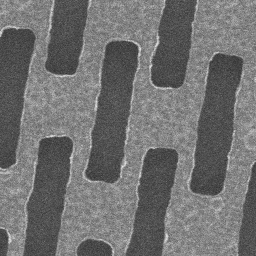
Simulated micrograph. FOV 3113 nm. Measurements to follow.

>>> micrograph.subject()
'holes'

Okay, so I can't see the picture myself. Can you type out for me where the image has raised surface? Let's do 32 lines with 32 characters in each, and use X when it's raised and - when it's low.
XXXXXXX----XXXXXXXXXX----XXXXXXX
XXXXXXX----XXXXXXXXX----XXXXXXXX
XXXXXX-----XXXXXXXXX----XXXXXXXX
XXXXXX-----XXXXXXXXX----XXXXXXXX
----XX----XXXXXXXXXX----XXXXXXXX
----XX----XXX----XXX----XXXXXXXX
----XX----XXX----XX-----XXXXXXXX
----XX----XXX----XX-----XX----XX
----XX----XXX----XX----XXX----XX
----XXXXXXXXX----XX----XXX----XX
---XXXXXXXXXX----XX----XXX----XX
---XXXXXXXXXX----XXXXXXXXX----XX
---XXXXXXXXX----XXXXXXXXX----XXX
---XXXXXXXXX----XXXXXXXXX----XXX
---XXXXXXXXX----XXXXXXXXX----XXX
---XXXXXXXXX----XXXXXXXXX----XXX
---XXXXXXXX-----XXXXXXXXX----XXX
--XXX----XX-----XXXXXXXXX----XXX
--XXX----XX-----XXXX-XXX-----XXX
--XXX----XX-----XX----XX-----XXX
--XXX----XX----XXX----XX----XXXX
XXXX-----XX----XXX----XX----XXX-
XXXX-----XX----XX-----XX----XXX-
XXXX----XXXXXXXXX-----XX----XXX-
XXXX----XXXXXXXXX----XXXXXXXXXX-
XXX-----XXXXXXXXX----XXXXXXXXX--
XXX-----XXXXXXXXX----XXXXXXXXX--
XXX-----XXXXXXXXX----XXXXXXXXX--
XXX-----XXXXXXXXX----XXXXXXXXX--
-XX----XXXXXXXXX-----XXXXXXXXX--
-XX----XXX---XXX-----XXXXXXXXX--
-XX----XXX----XX----XXXXXXXXXX--